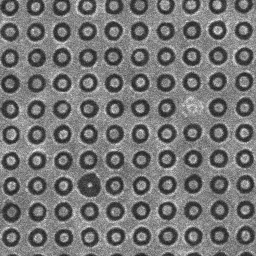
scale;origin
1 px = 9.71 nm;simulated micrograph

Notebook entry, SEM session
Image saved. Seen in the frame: a regular array of ring-shaped grooves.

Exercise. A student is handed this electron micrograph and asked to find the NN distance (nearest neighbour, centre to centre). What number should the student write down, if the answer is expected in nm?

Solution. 244